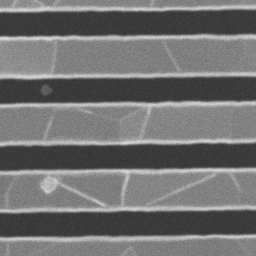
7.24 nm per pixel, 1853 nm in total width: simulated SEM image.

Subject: wiring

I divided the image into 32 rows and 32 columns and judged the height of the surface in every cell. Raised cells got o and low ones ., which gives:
oooooooooooooooooooooooooooooooo
................................
................................
................................
................................
oooooooooooooooooooooooooooooooo
oooooooooooooooooooooooooooooooo
oooooooooooooooooooooooooooooooo
oooooooooooooooooooooooooooooooo
..ooo...........................
................................
................................
................................
oooooooooooooooooooooooooooooooo
oooooooooooooooooooooooooooooooo
oooooooooooooooooooooooooooooooo
oooooooooooooooooooooooooooooooo
oooooooooooooooooooooooooooooooo
................................
................................
................................
..........oooooooo..oooooooooooo
oooooooooooooooooooooooooooooooo
oooooooooooooooooooooooooooooooo
oooooooooooooooooooooooooooooooo
oooooooooooooooooooooooooooooooo
................................
................................
................................
................................
oooooooooooooooooooooooooooooooo
oooooooooooooooooooooooooooooooo